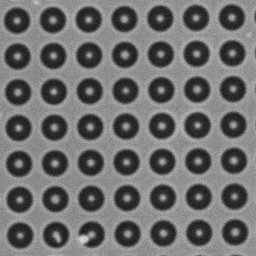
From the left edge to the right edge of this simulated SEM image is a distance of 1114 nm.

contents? an array of small figures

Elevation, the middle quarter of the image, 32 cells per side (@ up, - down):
@@@@----@@@@@----@@@@@----@@@@@@
@@@@@@@@@@@@@@@@@@@@@@@@@@@@@@@@
@@@@@@@@@@@@@@@@@@@@@@@@@@@@@@@@
@@@@@@-@@@@@@@--@@@@@@@---@@@@@@
@@@@-----@@@@-----@@@@-----@@@--
-@@-------@@-------@@-------@@--
-@@---@---@@---@---@@---@---@@--
-@@-------@@-------@@-------@@--
-@@@-----@@@------@@@@-----@@@@-
@@@@----@@@@@----@@@@@@---@@@@@@
@@@@@@@@@@@@@@@@@@@@@@@@@@@@@@@@
@@@@@@@@@@@@@@@@@@@@@@@@@@@@@@@@
@@@@@--@@@@@@@---@@@@@@---@@@@@-
@@@@-----@@@@-----@@@@-----@@@--
-@@-------@@-------@@-------@@--
-@@---@---@@---@---@@---@---@@--
-@@-------@@-------@@-------@@--
-@@@------@@@-----@@@@-----@@@--
@@@@-----@@@@@---@@@@@@---@@@@@@
@@@@@@@@@@@@@@@@@@@@@@@@@@@@@@@@
@@@@@@@@@@@@@@@@@@@@@@@@@@@@@@@@
@@@@@@--@@@@@@---@@@@@@---@@@@@@
@@@@-----@@@@-----@@@@-----@@@@-
-@@@------@@-------@@-------@@--
-@@---@---@@---@---@@---@---@@--
-@@-------@@-------@@-------@@--
-@@@------@@@-----@@@@-----@@@@-
@@@@@----@@@@@---@@@@@@---@@@@@@
@@@@@@@@@@@@@@@@@@@@@@@@@@@@@@@@
@@@@@@@@@@@@@@@@@@@@@@@@@@@@@@@@
@@@@@@--@@@@@@---@@@@@@----@@@@@
@@@@-----@@@@-----@@@@------@@@-